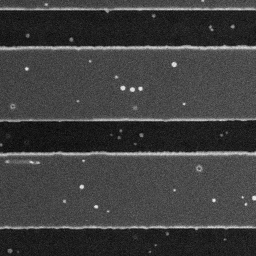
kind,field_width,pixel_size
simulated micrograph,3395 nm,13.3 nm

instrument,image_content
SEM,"lines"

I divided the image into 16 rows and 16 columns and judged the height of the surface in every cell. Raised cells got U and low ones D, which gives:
UUUUUUUUUUUUUUUU
DDDDDDDDDDDDDDDD
DDDDDDDDDDDDDDDD
UUUUUUUUUUUUUUUU
UUUUUUUUUUUUUUUU
UUUUUUUUUUUUUUUU
UUUUUUUUUUUUUUUU
UUUUUUUUUUUUUUUU
DDDDDDDDDDDDDDDD
DDDDDDDDDDDDDDDD
UUUUUUUUUUUUUUUU
UUUUUUUUUUUUUUUU
UUUUUUUUUUUUUUUU
UUUUUUUUUUUUUUUU
DDDDDDDDDDDDDDDD
DDDDDDDDDDDDDDDD